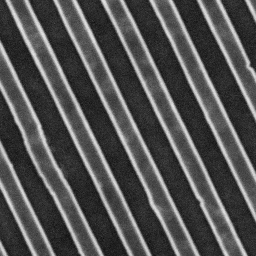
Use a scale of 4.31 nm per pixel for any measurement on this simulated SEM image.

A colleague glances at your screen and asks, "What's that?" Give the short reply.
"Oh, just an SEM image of parallel lines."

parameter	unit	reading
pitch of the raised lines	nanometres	186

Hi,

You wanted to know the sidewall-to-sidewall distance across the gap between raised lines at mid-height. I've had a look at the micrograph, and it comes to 108 nanometers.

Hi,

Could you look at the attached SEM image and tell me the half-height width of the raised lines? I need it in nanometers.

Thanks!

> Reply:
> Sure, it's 79.1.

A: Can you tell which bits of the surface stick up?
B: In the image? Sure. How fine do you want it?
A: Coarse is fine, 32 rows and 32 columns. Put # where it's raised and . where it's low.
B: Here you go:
.###...###...###...###...###...#
..##....##....##....##....##....
..###...###...###...###...###...
..###...###....##....##....##...
...###...###...###...##....###..
....##...###...###....##...###..
#...##....##....###...##....##..
#...###...###...###....##...###.
#....##....##....##....##....##.
##...###...###...###...###...###
##....##....##....##....##....##
###...###...###...###...###...##
.##....##....##....##....##....#
.###...###...###...###...###...#
..##....##....##....##....##....
..###...###...###...###...###...
...##....##....##....##....##...
...###...###...###...###...###..
....##....##....##....##....##..
#...##....###...###...###...###.
#...###....##....##....##....##.
##...###...###...###...###...###
##...###....##....##....##....##
###...###...###...###...###...##
.##....##....##....##....##....#
.###...###...###...###...###...#
..##....##....##....##....##....
..###...###...###...###...###...
...##....##....##....##....##...
...###...###...###...###...###..
....##....##....##....##....##..
#...###...###...###...###...##..